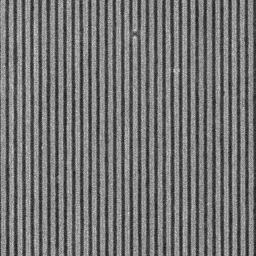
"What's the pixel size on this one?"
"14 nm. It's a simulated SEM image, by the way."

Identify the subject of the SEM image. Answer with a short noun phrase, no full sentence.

parallel lines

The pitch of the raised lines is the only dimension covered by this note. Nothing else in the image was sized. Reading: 116 nanometres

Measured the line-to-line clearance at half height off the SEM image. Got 3.75 px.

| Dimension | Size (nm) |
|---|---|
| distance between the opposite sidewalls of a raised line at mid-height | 52.5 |